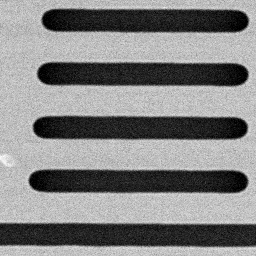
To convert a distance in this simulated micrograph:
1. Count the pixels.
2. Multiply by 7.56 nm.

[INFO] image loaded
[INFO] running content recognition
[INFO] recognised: groups of lines, slits or small figures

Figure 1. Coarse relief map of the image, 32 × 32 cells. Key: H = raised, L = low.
HHHHHHHHHHHHHHHHHHHHHHHHHHHHHHHH
HHHHHHLLLLLLLLLLLLLLLLLLLLLLLLHH
HHHHHLLLLLLLLLLLLLLLLLLLLLLLLLLH
HHHHHHLLLLLLLLLLLLLLLLLLLLLLLLLH
HHHHHHHHHHHHHHHHHHHHHHHHHHHHHHHH
HHHHHHHHHHHHHHHHHHHHHHHHHHHHHHHH
HHHHHHHHHHHHHHHHHHHHHHHHHHHHHHHH
HHHHHHHHHHHHHHHHHHHHHHHHHHHHHHHH
HHHHHLLLLLLLLLLLLLLLLLLLLLLLLLLH
HHHHHLLLLLLLLLLLLLLLLLLLLLLLLLLH
HHHHHHLLLLLLLLLLLLLLLLLLLLLLLLHH
HHHHHHHHHHHHHHHHHHHHHHHHHHHHHHHH
HHHHHHHHHHHHHHHHHHHHHHHHHHHHHHHH
HHHHHHHHHHHHHHHHHHHHHHHHHHHHHHHH
HHHHHHLLLLLLLLLLLLLLLLLLHHHHHHHH
HHHHLLLLLLLLLLLLLLLLLLLLLLLLLLLH
HHHHLLLLLLLLLLLLLLLLLLLLLLLLLLLH
HHHHHHHHHHHHLLLLLLLLLLLLLLLLLHHH
HHHHHHHHHHHHHHHHHHHHHHHHHHHHHHHH
HHHHHHHHHHHHHHHHHHHHHHHHHHHHHHHH
HHHHHHHHHHHHHHHHHHHHHHHHHHHHHHHH
HHHHLLLLLLLLLLLLLLLLLLLLLLLLLLHH
HHHHLLLLLLLLLLLLLLLLLLLLLLLLLLLH
HHHHLLLLLLLLLLLLLLLLLLLLLLLLLLLH
HHHHHHHHHHHHHHHHHHHHHHHHHHHHHHHH
HHHHHHHHHHHHHHHHHHHHHHHHHHHHHHHH
HHHHHHHHHHHHHHHHHHHHHHHHHHHHHHHH
HHHHHHHHHHHHHHHHHHHHHHHHHHHHHHHH
LLLLLLLLLLLLLLLLLLLLLLLLLLLLLLLL
LLLLLLLLLLLLLLLLLLLLLLLLLLLLLLLL
LLLLLLLLLLLLLLLLLLLLLLLLLLLLLLLL
HHHHHHHHHHHHHHHHHHHHHHHHHHHHHHHH